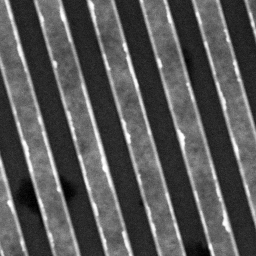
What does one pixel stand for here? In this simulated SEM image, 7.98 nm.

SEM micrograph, parallel lines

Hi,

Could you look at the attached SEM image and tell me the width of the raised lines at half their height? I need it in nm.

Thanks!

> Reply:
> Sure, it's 202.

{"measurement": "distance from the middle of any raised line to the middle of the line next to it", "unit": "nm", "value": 404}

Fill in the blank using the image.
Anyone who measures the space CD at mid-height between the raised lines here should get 203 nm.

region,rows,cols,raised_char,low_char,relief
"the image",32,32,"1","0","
10001111000111000011100011100001
10000111000111100011100011110001
11000111000011100011100001110001
11000111100011100011110001110000
11000011100011100001110001111000
11100011100011110001110000111000
11100011100001110001111000111000
11100011110001110000111000111000
11100001110001111000111000111100
11110001110000111000111000011100
01110001111000111000111100011100
01110000111000111000011100011110
01110000111000111100011100001110
00111000111000011100011110001110
00111000111100011100001110001110
00111000011100011100001110001111
00111100011100001110001110000111
00011100011100001110001111000111
00011100011110001110000111000111
00011100001110001111000111000011
00011110001110000111000111000011
00001110001111000111000011100011
10001110000111000111000011100011
10001111000111000011100011100001
10000111000111000011100011110001
11000111000111100011100001110001
11000111000011100011110001110000
11000111100011100001110001110000
11000011100011110001110000111000
11100011100001110001110000111000
11100011110001110000111000111000
11100001110001110000111000111100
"